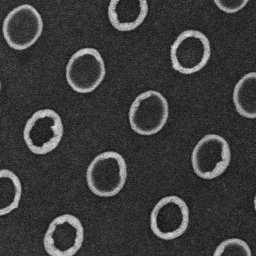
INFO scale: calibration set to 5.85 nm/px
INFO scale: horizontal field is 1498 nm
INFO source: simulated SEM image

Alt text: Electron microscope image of a regular array of raised bodies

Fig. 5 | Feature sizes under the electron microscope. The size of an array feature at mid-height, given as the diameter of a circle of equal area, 225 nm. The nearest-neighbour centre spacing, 432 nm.